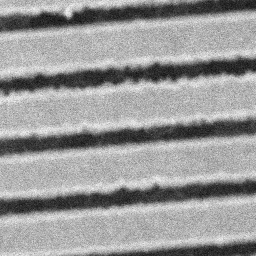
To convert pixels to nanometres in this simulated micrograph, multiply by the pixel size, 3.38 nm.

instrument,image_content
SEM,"one or a few lines or trenches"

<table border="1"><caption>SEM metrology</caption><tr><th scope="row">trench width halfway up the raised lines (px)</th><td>21.1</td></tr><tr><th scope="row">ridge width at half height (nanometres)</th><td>135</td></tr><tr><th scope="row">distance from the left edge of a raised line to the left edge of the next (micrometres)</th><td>0.207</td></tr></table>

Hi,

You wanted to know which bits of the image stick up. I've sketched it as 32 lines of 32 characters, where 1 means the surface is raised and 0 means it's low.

11111111111111100000000000000000
11001001100000000000000000000000
00000000000000000000001111111111
00000000000111111111111111111111
11111111111111111111111111111111
11111111111111111111111111111111
11111111111111111111111111111111
11111111111111111111111100000000
11111111111000000000000000000000
10000000000000000000000000001011
00000000000000000110111111111111
00000010111111111111111111111111
11111111111111111111111111111111
11111111111111111111111111111111
11111111111111111111111111111110
11111111111111111110000000000000
11111110000000000000000000000000
00000000000000000000000000111111
00000000000000001111111111111111
00001111111111111111111111111111
11111111111111111111111111111111
11111111111111111111111111111111
11111111111111111111111111000000
11111111111111000000000000000000
11000000000000000000000000000000
00000000000000000000000111111111
00000000001111111111111111111111
11111111111111111111111111111111
11111111111111111111111111111111
11111111111111111111111111111111
11111111111111111111111000000000
11111111111000000000000000000000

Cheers